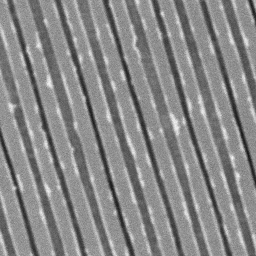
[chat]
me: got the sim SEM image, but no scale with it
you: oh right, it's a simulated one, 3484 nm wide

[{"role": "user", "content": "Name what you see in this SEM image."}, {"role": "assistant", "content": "parallel lines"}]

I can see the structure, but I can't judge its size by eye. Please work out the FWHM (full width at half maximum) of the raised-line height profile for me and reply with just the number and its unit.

199 nanometers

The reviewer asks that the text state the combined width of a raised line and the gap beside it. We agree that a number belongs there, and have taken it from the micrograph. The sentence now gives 315 nm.